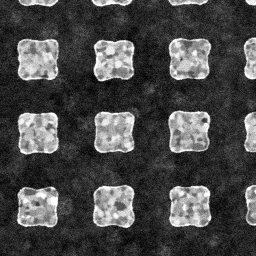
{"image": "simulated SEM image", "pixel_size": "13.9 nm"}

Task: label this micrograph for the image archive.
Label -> a regular array of raised bodies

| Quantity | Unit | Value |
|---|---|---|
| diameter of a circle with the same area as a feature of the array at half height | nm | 601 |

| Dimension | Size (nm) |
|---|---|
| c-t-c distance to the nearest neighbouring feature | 1020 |